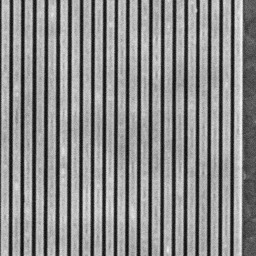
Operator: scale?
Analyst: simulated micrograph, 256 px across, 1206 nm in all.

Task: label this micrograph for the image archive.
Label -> parallel lines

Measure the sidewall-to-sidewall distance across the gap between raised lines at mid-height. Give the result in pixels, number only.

3.86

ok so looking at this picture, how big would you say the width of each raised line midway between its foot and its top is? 7.75 pixels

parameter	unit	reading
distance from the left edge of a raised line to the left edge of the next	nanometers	54.8